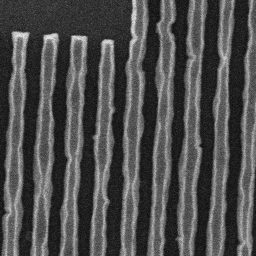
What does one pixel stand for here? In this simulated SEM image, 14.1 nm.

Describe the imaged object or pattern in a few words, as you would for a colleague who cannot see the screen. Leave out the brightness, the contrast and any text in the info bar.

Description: parallel lines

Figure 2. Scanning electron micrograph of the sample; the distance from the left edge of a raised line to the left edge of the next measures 412 nm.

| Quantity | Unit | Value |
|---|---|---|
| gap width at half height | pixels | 15.9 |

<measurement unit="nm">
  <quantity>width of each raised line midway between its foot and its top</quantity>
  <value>182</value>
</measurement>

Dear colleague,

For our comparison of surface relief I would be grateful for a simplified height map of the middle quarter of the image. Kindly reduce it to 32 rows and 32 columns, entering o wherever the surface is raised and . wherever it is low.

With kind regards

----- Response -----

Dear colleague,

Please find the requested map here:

..ooo....ooo....ooo.....ooo....o
..ooo....ooo....ooo.....ooo....o
..ooo....ooo....oooo....ooo....o
..ooo....ooo....oooo....ooo....o
..ooo....ooo....oooo....oo.....o
.oooo....ooo....oooo....oo.....o
.oooo....ooo....oooo....oo.....o
.oooo....ooo....ooo.....ooo....o
.oooo....ooo....ooo.....ooo....o
.oooo....ooo....oooo....oo.....o
.oooo....ooo....ooo.....ooo....o
.ooo.....ooo....ooo.....ooo....o
.ooo.....ooo....ooo.....ooo....o
.ooo.....ooo....ooo.....oo....oo
.ooo.....ooo...oooo....ooo....oo
.ooo....oooo...oooo....ooo....oo
.ooo.....ooo...oooo....ooo.....o
.ooo....oooo...oooo....ooo.....o
.ooo....oooo...oooo....ooo.....o
.ooo....oooo...oooo....ooo....oo
.ooo....ooo....oooo....ooo....oo
.ooo....oooo...ooo....oooo....oo
.ooo....oooo...ooo....oooo....oo
.ooo....oooo...ooo....oooo....oo
.ooo....ooo....oooo....ooo....oo
.ooo....ooo....oooo...oooo...ooo
.ooo....ooo....ooo.....ooo...ooo
.ooo....ooo....ooo.....ooo...ooo
.ooo....ooo....ooo....oooo...ooo
.ooo....oo......oo.....ooo...ooo
.oo.....oo......oo....ooo....ooo
.oo.....oo.....ooo....ooo....ooo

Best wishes